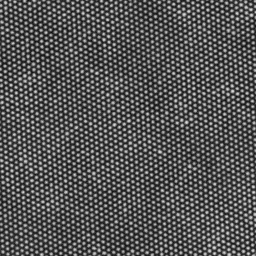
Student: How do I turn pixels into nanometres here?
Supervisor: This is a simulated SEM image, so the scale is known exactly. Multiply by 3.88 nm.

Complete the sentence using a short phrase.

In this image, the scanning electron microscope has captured a regular array of raised bodies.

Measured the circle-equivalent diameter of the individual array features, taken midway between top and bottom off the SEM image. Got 12.4 nanometers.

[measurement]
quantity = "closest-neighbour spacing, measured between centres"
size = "20.4 nm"